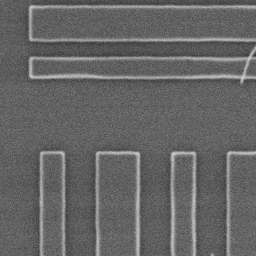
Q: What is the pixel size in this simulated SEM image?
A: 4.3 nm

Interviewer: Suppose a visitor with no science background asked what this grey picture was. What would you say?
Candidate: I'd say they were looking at groups of lines, slits or small figures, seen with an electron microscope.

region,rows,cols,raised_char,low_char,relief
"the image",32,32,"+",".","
................................
....++++++++++++++++++++++++++++
....++++++++++++++++++++++++++++
....++++++++++++++++++++++++++++
....++++++++++++++++++++++++++++
................................
................................
....++++++++++++++++++++++++++++
....++++++++++++++++++++++++++++
....++++++++++++++++++++++++++++
................................
................................
................................
................................
................................
................................
................................
................................
................................
.....+++....+++++.....++....++++
.....+++....+++++.....++....++++
.....+++....+++++....+++....++++
.....+++....+++++....+++....++++
.....+++....+++++....+++....++++
.....+++....+++++....+++....++++
.....+++....+++++.....++....++++
.....+++....+++++.....++....++++
.....+++....+++++.....++....++++
.....+++....+++++.....++....++++
.....+++....+++++.....++....++++
.....+++....+++++.....++....++++
.....+++....+++++.....++....++++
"